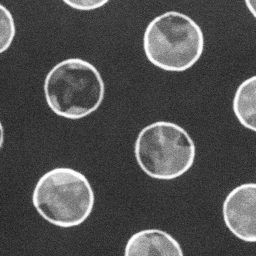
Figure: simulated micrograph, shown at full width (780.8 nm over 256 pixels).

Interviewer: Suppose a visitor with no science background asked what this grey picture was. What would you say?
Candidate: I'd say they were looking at raised bodies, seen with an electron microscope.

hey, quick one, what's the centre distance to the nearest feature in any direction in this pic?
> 0.333 um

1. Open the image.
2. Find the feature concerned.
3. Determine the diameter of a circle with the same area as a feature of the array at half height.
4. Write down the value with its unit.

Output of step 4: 171 nanometers